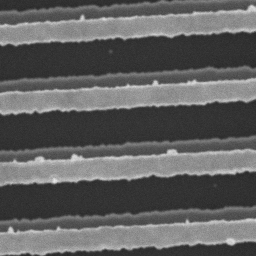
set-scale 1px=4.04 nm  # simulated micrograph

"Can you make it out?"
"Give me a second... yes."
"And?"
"lines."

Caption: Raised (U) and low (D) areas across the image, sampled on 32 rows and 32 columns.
DDDDDDDDDDDDDDDDDUUUUUUUUUUUUUUU
DUUUUUUUUUUUUUUUUUUUUUUUUUUUUUUU
UUUUUUUUUUUUUUUUUUUUUUUUUUUUUUUU
UUUUUUUUUUUUUUUUUUUUUUUUUUUUUUUU
UUUUUUUUUUUUUUUUUUDDDUDDDDDDDDDD
UUUDDDDDDDDDDDDDDDDDDDDDDDDDDDDD
DDDDDDDDDDDDDDDDDDDDDDDDDDDDDDDD
DDDDDDDDDDDDDDDDDDDDDDDDDDDDDDDD
DDDDDDDDDDDDDDDDDDDDDDDDDDDDDDUD
DDDDDDDDDDDDDUUUUUUUUUUUUUUUUUUU
UUUUUUUUUUUUUUUUUUUUUUUUUUUUUUUU
UUUUUUUUUUUUUUUUUUUUUUUUUUUUUUUU
UUUUUUUUUUUUUUUUUUUUUUUUUUUUUUUD
UUUUUUUUUUUUUUUDDDDDDDDDDDDDDDDD
DDDDDDDDDDDDDDDDDDDDDDDDDDDDDDDD
DDDDDDDDDDDDDDDDDDDDDDDDDDDDDDDD
DDDDDDDDDDDDDDDDDDDDDDDDDDDDDDDD
DDDDDDDDDDDDDDDDDDDDDDDDDDUUUUUU
DDDDDDDUUUUUUUUUUUUUUUUUUUUUUUUU
UUUUUUUUUUUUUUUUUUUUUUUUUUUUUUUU
UUUUUUUUUUUUUUUUUUUUUUUUUUUUUUUU
UUUUUUUUUUUUUUUUUUUUUUUUUUUUUUDD
UUUUUUUUUUUUDUDDDDDDDDDDDDDDDDDD
DDDDDDDDDDDDDDDDDDDDDDDDDDDDDDDD
DDDDDDDDDDDDDDDDDDDDDDDDDDDDDDDD
DDDDDDDDDDDDDDDDDDDDDDDDDDDDDDDD
DDDDDDDDDDDDDDDDDDDUUUUUUUUUUUUU
DDDDUUUUUUUUUUUUUUUUUUUUUUUUUUUU
UUUUUUUUUUUUUUUUUUUUUUUUUUUUUUUU
UUUUUUUUUUUUUUUUUUUUUUUUUUUUUUUU
UUUUUUUUUUUUUUUUUUUUUUUUUUUDDDDD
UUUUUUUDDDDDDDDDDDDDDDDDDDDDDDDD